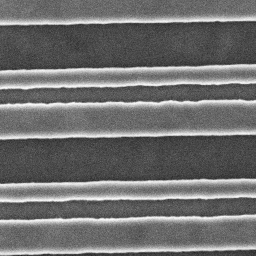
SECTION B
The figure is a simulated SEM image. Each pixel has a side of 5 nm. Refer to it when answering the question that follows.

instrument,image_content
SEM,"lines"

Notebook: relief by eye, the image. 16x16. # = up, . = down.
################
#####...........
................
................
################
################
################
################
##########......
................
................
.###############
################
################
################
################